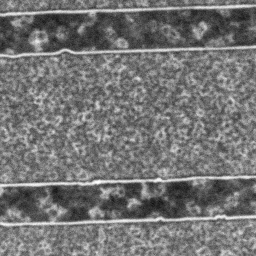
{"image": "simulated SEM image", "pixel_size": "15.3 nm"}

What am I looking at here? one or a few lines or trenches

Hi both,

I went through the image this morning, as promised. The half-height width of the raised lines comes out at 632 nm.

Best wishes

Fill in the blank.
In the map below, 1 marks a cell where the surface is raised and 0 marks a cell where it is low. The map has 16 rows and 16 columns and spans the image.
0000000000011111
1111111111111111
1111111111111111
1000000000000000
0000000000000000
0000000000000000
0000000000000000
0000000000000000
0000000000000000
0000000000000000
0000000000000000
0011111111111111
1111111111111111
1111111111111111
0000000000000000
0000000000000000